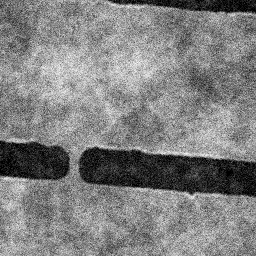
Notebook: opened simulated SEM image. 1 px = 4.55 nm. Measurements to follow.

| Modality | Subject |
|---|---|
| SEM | one or a few lines or trenches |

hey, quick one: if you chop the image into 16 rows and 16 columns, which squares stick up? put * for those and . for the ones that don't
***********.....
****************
****************
****************
****************
****************
****************
****************
****************
....*....*******
....*...........
******..........
****************
****************
****************
****************